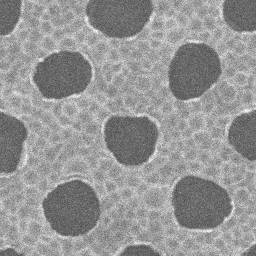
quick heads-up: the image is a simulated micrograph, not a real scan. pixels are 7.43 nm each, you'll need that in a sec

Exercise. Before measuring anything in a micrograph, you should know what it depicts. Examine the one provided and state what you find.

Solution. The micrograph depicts holes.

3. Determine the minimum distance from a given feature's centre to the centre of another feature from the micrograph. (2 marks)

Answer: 689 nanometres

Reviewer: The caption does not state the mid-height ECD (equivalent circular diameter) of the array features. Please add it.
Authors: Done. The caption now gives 409 nanometers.